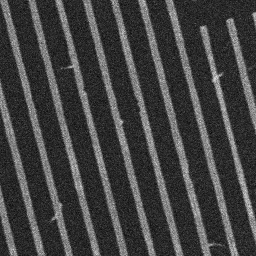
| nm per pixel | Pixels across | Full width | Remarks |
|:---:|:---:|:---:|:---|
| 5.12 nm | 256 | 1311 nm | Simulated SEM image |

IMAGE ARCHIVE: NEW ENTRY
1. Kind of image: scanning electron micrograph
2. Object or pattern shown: parallel lines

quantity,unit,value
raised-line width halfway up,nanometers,33.5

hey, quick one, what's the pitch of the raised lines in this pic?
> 26.7 pixels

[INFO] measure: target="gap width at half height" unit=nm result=106